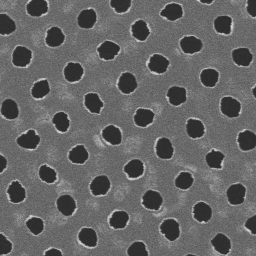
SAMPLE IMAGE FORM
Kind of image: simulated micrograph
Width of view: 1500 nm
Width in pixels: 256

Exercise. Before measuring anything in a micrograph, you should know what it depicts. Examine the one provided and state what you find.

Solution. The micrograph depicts a regular array of holes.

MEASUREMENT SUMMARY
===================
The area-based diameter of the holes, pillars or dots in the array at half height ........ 111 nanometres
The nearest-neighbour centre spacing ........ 0.213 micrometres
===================